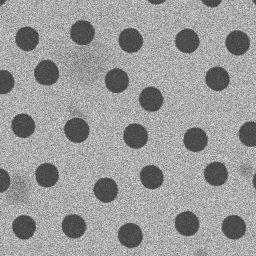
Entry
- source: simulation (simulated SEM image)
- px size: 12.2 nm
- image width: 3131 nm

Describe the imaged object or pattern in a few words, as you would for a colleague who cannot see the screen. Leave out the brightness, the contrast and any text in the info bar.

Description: a regular array of holes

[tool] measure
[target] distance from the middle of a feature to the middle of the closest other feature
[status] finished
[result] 558 nm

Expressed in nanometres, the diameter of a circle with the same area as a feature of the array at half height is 302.